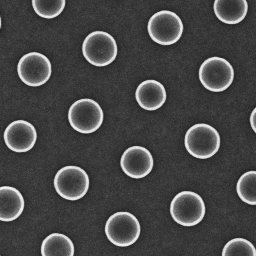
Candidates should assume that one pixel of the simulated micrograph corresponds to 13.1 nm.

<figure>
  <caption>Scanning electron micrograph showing a regular array of raised bodies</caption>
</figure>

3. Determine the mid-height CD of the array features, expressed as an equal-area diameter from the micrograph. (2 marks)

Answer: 424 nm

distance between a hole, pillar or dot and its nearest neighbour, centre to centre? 68.4 px